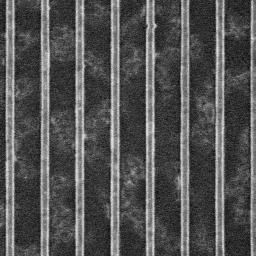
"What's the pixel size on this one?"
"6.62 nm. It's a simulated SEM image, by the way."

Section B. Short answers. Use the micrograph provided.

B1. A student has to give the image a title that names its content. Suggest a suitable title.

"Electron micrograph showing parallel lines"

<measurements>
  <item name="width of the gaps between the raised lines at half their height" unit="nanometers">189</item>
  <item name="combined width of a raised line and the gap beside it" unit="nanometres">231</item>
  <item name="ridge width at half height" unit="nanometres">45.5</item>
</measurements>